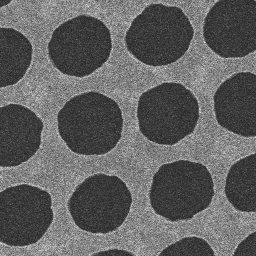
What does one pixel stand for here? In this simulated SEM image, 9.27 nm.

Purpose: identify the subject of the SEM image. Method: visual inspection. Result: holes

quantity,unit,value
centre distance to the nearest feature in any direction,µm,0.726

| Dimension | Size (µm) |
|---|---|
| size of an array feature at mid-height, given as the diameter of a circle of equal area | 0.579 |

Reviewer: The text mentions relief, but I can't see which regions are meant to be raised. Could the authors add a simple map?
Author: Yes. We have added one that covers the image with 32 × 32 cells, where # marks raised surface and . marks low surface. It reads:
.##########################.....
##################.....###......
#########...#####.......##......
.######......###........#.......
...###........##........#.......
....##........##........##......
....##........##.......####.....
....##.......####.....##########
....###.....####################
...######..##################...
..##################..######....
###########.######......###.....
#########.....###........##.....
...#####.......##........##.....
.....##........##........##.....
.....##........##........##.....
.....##........###......#####...
.....###.......####....#########
.....####.....##################
....###########################.
...##################....####...
####################......###...
###########....####........#....
#....####.......###........#....
......###.......###........#....
......###.......###.......###...
.......##.......###......#######
.......##.......#####..#########
......####.....#################
.....##########################.
#...#################.....####..
#############...####.......##...